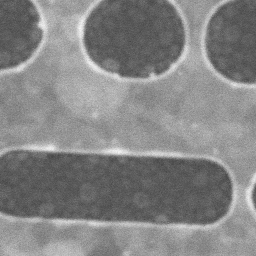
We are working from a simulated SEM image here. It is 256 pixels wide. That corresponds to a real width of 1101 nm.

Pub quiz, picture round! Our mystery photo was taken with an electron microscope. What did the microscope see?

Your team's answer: one or a few lines or trenches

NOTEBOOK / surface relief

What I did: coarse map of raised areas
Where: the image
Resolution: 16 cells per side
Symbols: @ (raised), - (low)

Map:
--@@@@-----@@@--
---@@-------@---
---@@-------@---
--@@@------@@---
@@@@@@@---@@@@--
@@@@@@@@@@@@@@@@
@@@@@@@@@@@@@@@@
@@@@@@@@@@@@@@@@
@@@@@@@@@@@@@@@@
-----@@@@@@@@@@@
--------------@@
---------------@
---------------@
--------------@@
@@@@@@@@@@@@@@@@
@@@@@@@@@@@@@@@@